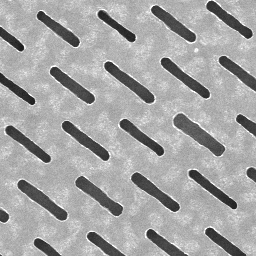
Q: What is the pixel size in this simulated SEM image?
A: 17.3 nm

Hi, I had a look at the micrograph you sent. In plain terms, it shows a regular array of holes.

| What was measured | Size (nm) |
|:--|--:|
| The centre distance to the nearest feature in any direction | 976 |